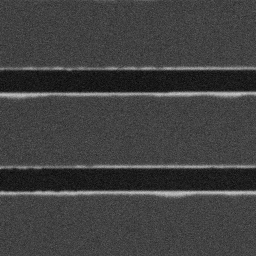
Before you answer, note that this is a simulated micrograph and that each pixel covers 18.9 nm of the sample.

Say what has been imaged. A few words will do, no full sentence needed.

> lines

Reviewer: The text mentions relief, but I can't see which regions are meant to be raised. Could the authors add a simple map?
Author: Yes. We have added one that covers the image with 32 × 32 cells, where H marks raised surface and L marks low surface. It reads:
HHHHHHHHHHHHHHHHHHHHHHHHHHHHHHHH
HHHHHHHHHHHHHHHHHHHHHHHHHHHHHHHH
HHHHHHHHHHHHHHHHHHHHHHHHHHHHHHHH
HHHHHHHHHHHHHHHHHHHHHHHHHHHHHHHH
HHHHHHHHHHHHHHHHHHHHHHHHHHHHHHHH
HHHHHHHHHHHHHHHHHHHHHHHHHHHHHHHH
HHHHHHHHHHHHHHHHHHHHHHHHHHHHHHHH
HHHHHHHHHHHHHHHHHHHHHHHHHHHHHHHH
HHHHHHHHHHHHHHHHHHHHHHHHHHHHHHHH
LLLLLLLLLLLLLLLLLLLLLLLLLLLLLLLL
LLLLLLLLLLLLLLLLLLLLLLLLLLLLLLLL
LLLLLLLLLLLLLLLLLLLLLLLLLLLLLLLL
HHHHHHHHHHHHHHHHHHHHHHHHHHHHHHHH
HHHHHHHHHHHHHHHHHHHHHHHHHHHHHHHH
HHHHHHHHHHHHHHHHHHHHHHHHHHHHHHHH
HHHHHHHHHHHHHHHHHHHHHHHHHHHHHHHH
HHHHHHHHHHHHHHHHHHHHHHHHHHHHHHHH
HHHHHHHHHHHHHHHHHHHHHHHHHHHHHHHH
HHHHHHHHHHHHHHHHHHHHHHHHHHHHHHHH
HHHHHHHHHHHHHHHHHHHHHHHHHHHHHHHH
HHHHHHHHHHHHHHHHHHHHHHHHHHHHHHHH
LLLLLLLLLLLLLLLLLLLLLLLLLLLLLLLL
LLLLLLLLLLLLLLLLLLLLLLLLLLLLLLLL
LLLLLLLLLLLLLLLLLLLLLLLLLLLLLLLL
HHHHHHHHHHHHHHHHHHHHHHHHHHHHHHHH
HHHHHHHHHHHHHHHHHHHHHHHHHHHHHHHH
HHHHHHHHHHHHHHHHHHHHHHHHHHHHHHHH
HHHHHHHHHHHHHHHHHHHHHHHHHHHHHHHH
HHHHHHHHHHHHHHHHHHHHHHHHHHHHHHHH
HHHHHHHHHHHHHHHHHHHHHHHHHHHHHHHH
HHHHHHHHHHHHHHHHHHHHHHHHHHHHHHHH
HHHHHHHHHHHHHHHHHHHHHHHHHHHHHHHH